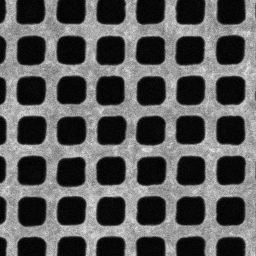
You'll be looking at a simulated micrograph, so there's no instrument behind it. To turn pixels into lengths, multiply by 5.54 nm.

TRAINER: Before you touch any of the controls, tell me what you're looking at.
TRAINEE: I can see a regular array of holes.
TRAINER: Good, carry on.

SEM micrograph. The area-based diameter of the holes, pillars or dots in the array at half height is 170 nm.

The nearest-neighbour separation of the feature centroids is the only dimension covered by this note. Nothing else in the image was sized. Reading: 0.219 µm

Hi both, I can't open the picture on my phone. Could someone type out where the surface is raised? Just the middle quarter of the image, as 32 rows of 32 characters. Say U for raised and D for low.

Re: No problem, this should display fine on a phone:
UUUUUUUUUUUUUUUUUUUUUUUUUUUUUUUU
UUUUUUUUUUUUUUUUUUUUUUUUUUUUUUUU
UUUUUUUUUUUUUUUUUUUUUUUUUUUUUUUU
DDDDDUUUUDDDDDUUUUUDDDDDUUUUUDDD
DDDDDUUUUDDDDDDUUUUDDDDDDUUUDDDD
DDDDDUUUDDDDDDDUUUDDDDDDDUUUDDDD
DDDDDDUUDDDDDDDUUUDDDDDDDUUUDDDD
DDDDDDUUDDDDDDDUUUDDDDDDDUUUDDDD
DDDDDUUUDDDDDDDUUUDDDDDDDUUUDDDD
DDDDDUUUDDDDDDDUUUUDDDDDDUUUDDDD
UUUUUUUUUUUUUUUUUUUUUUUUUUUUUUUU
UUUUUUUUUUUUUUUUUUUUUUUUUUUUUUUU
UUUUUUUUUUUUUUUUUUUUUUUUUUUUUUUU
DDDDDUUUUDDDDDDUUUUDDDDDUUUUUDDD
DDDDDUUUUDDDDDDUUUUDDDDDDUUUDDDD
DDDDDUUUDDDDDDDDUUDDDDDDDUUUDDDD
DDDDDUUUDDDDDDDUUUDDDDDDDUUUDDDD
DDDDDDUUDDDDDDDUUUDDDDDDDUUUDDDD
DDDDDUUUDDDDDDDUUUDDDDDDDUUUDDDD
DDDDDUUUUDDDDDDUUUUDDDDDDUUUDDDD
UUUUUUUUUUUUUUUUUUUUUUUUUUUUUUUU
UUUUUUUUUUUUUUUUUUUUUUUUUUUUUUUU
UUUUUUUUUUUUUUUUUUUUUUUUUUUUUUUU
UUDDDUUUUUDDDDDUUUUUDDDDDUUUUDDD
DDDDDUUUUDDDDDDUUUUDDDDDDUUUUDDD
DDDDDUUUDDDDDDDUUUDDDDDDDUUUDDDD
DDDDDUUUDDDDDDDUUUDDDDDDDUUUDDDD
DDDDDUUUDDDDDDDUUUDDDDDDDUUUDDDD
DDDDDUUUDDDDDDDUUUDDDDDDDUUUDDDD
DDDDDUUUDDDDDDDUUUDDDDDDDUUUDDDD
DDDDUUUUUUDDUUUUUUUUDUUUUUUUUUUU
UUUUUUUUUUUUUUUUUUUUUUUUUUUUUUUU